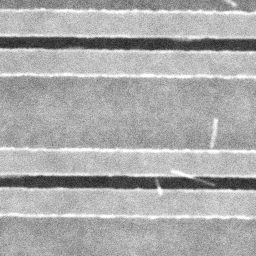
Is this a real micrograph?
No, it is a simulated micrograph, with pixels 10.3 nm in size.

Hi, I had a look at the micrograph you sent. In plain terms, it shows lines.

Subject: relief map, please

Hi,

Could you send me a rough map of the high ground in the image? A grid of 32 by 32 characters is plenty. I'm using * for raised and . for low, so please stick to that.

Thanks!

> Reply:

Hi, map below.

................................
**************************......
********************************
********************************
.........***********************
................................
******************************..
********************************
********************************
....................****..******
................................
................................
................................
................................
................................
................................
................................
................................
................................
********************************
********************************
********************************
................................
................................
********************************
********************************
********************************
................................
................................
................................
................................
................................